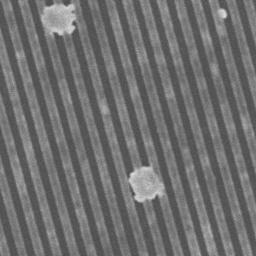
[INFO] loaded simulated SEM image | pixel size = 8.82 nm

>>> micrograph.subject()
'parallel lines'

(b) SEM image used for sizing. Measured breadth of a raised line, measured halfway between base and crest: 7.72 px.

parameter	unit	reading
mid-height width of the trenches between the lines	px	8.67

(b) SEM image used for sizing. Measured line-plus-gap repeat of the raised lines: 147 nanometers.